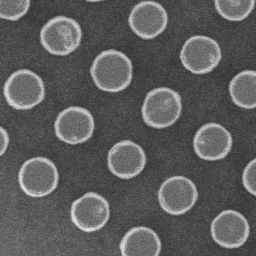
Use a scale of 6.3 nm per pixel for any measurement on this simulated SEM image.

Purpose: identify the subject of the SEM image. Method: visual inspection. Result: a regular array of raised bodies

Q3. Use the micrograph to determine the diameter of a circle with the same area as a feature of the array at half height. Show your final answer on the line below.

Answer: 234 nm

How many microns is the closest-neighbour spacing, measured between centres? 0.392